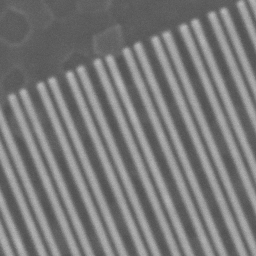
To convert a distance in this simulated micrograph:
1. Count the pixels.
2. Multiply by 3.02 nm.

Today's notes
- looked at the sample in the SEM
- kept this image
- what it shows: parallel lines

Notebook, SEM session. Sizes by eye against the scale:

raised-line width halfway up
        0.0174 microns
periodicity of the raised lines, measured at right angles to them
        46.5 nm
